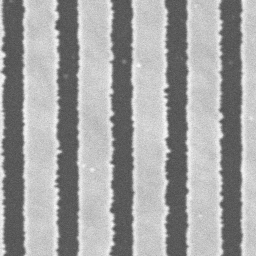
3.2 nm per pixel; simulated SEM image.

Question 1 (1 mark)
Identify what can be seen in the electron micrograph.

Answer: lines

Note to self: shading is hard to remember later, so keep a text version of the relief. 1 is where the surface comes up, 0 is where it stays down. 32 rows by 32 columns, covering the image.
00011110001111000111100111100011
00011110001111000111100111100011
00011110001111000111100111110011
00011110001111000111100111110011
00011110001111000111100111110011
00011110001111000111100111110011
00011110001111000111100111110011
00011110001111000111100111110011
00011110001111000111100111110011
00011110001111000111100111110011
00011110001111000111100111110011
00011110001111000111100111110011
00011110001111000111100011100011
00011110001111000111100111100011
00011110001111000111100111110011
00011110001111000111100111100011
00011110001111000111100111110011
00011110001111000111100111110011
00011110001111000111100111110011
00011110001111000111100111110011
00011110001111000111100111110011
00011110001111000111100111100011
00011110001111000111100111110011
00011110001111000111100111110011
00011110001111000111100111110011
00011110001111000111100111110011
00011110001111000111100111110011
00011110001111000111100111110011
00011110001111000111100111110011
00011110001111000111100111110011
00011110001111000111100111110011
10011110001111000111100111110011